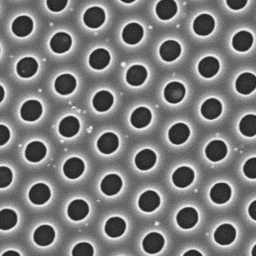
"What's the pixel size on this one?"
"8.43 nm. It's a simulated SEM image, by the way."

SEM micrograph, a regular array of holes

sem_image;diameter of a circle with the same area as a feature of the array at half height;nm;189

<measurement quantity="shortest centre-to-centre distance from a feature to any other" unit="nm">347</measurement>